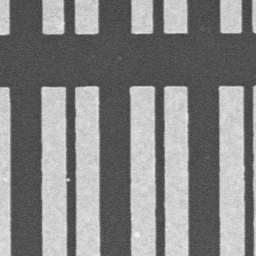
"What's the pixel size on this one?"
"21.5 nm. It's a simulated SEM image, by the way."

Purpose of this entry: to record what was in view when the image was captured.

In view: wiring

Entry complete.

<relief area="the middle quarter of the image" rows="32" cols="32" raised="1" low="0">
00000000000000000000000000000000
00000000000000000000000000000000
00000000000000000000000000000000
00000000000000000000000000000000
00000000000000000000000000000000
00000000000000000000000000000000
00011111000000000111110001111110
00011111000000000111110001111110
00011111000000000111110001111110
00011111000000000111110001111110
00011111000000000111110001111110
00011111000000000111110001111110
00011111000000000111110001111110
00011111000000000111110001111110
00011111000000000111110001111110
00011111000000000111110001111110
00011111100000000111110001111110
00011111100000000111110001111110
00011111100000000111110001111110
00011111100000000111110001111110
00011111100000000111110001111110
00011111100000000111110001111110
00011111100000000111110001111110
00011111100000000111110001111110
00011111100000000111110001111110
00011111100000000111110001111110
00011111100000000111110001111110
00011111100000000111110001111110
00011111100000000111110001111110
00011111100000000111110001111110
00011111100000000111111001111110
00011111100000000111111001111110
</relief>